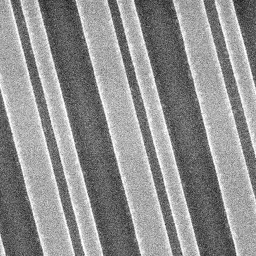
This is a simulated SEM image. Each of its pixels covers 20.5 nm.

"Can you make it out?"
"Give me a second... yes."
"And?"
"lines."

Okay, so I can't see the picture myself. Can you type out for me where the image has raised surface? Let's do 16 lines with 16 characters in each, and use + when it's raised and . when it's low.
++...+++...++++.
+++..++++..++++.
+++..++++..++++.
+++...+++...+++.
+++...+++...++++
++++..++++..++++
++++..++++..++++
.+++...+++...+++
.++++..++++..+++
.++++..++++..+++
.++++..++++..+++
..+++...+++...++
..++++..++++..++
..++++..++++..++
..++++...+++..++
...+++...+++...+